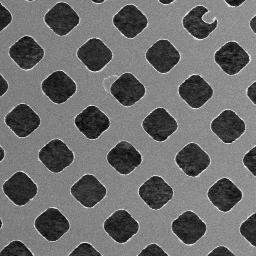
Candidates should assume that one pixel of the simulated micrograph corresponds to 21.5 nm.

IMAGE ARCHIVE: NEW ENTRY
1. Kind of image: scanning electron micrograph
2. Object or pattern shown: a regular array of holes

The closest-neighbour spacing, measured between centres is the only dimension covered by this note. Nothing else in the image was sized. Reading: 1030 nanometres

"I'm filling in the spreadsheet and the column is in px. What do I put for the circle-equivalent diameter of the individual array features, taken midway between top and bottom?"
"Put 32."